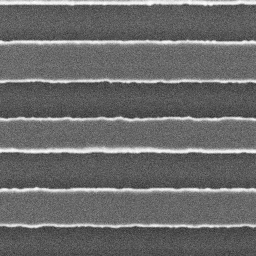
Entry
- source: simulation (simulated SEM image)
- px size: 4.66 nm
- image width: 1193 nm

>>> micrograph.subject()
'lines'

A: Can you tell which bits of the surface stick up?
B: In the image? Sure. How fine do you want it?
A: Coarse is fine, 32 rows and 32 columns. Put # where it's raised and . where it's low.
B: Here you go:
................................
................................
................................
................................
................................
################################
################################
################################
################################
################################
................................
................................
................................
................................
................................
################################
################################
################################
################################
................................
................................
................................
................................
................................
################################
################################
################################
################################
................................
................................
................................
................................